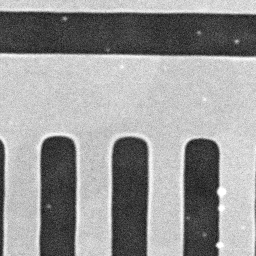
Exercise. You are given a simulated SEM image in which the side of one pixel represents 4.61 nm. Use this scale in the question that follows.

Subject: groups of lines, slits or small figures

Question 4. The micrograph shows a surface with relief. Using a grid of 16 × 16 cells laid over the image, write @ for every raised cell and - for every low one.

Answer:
@@@@@@@@@@@@@@@@
----------------
----------------
@@@@@@@@@-------
@@@@@@@@@@@@@@@@
@@@@@@@@@@@@@@@@
@@@@@@@@@@@@@@@@
@@@@@@@@@@@@@@@@
@@@-@@@@-@@@@@@@
@@---@@--@@---@@
@@---@@--@@---@@
@@---@@--@@---@@
@@---@@--@@---@@
@@---@@--@@---@@
@@---@@--@@---@@
@@---@@--@@---@@